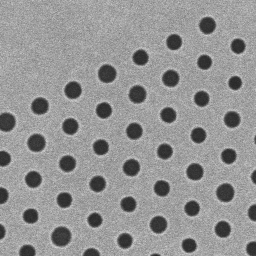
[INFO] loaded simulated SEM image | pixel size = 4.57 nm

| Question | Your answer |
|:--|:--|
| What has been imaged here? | a regular array of holes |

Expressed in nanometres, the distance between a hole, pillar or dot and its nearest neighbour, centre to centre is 167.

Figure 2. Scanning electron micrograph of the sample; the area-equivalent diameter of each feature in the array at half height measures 70.1 nm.